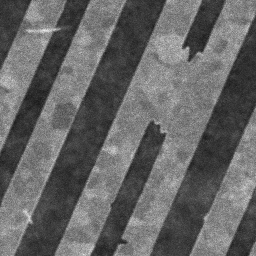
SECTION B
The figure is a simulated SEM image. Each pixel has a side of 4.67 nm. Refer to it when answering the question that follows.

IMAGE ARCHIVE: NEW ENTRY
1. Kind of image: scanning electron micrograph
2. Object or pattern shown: parallel lines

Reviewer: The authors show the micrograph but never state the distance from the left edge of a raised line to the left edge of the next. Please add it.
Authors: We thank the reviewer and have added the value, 288 nm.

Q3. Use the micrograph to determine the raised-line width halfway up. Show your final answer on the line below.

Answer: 146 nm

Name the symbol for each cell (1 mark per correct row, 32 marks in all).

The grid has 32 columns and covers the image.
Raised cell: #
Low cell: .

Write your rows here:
....####...#####.....####...####
...#####...####.....#####...####
...####...#####.....####...#####
..#####...####.....#####...####.
..####...#####.....####...#####.
..####...####.....#####...####..
.####....####.....######.#####..
.####...####......###########...
#####...####.....############...
####...####......###########....
####...####.....############....
###...#####.....############....
###...####.....############.....
##...#####.....############.....
##...####......###########......
##...####.....#####.######.....#
#...####......####..#####......#
#...####.....#####...####.....##
...#####.....####...#####.....##
...####.....#####...####.....###
..#####.....####...#####.....###
..####.....#####...####.....####
.#####.....####...#####.....####
.####......####...####......####
.####.....####....####.....####.
####......####...####......####.
####.....#####...####.....#####.
####.....####...#####.....####..
###.....#####...####.....#####..
###.....####...#####.....####...
##......####....###.....#####...
##.....####...#####.....####...#